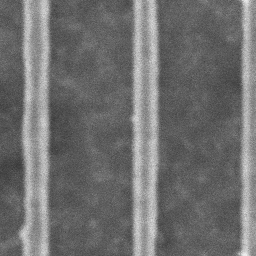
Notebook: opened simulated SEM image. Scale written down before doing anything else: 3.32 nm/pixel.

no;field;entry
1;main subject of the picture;one or a few lines or trenches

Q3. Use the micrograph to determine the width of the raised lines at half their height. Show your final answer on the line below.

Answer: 0.0556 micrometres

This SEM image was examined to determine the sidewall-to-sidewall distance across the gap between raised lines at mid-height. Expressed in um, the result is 0.305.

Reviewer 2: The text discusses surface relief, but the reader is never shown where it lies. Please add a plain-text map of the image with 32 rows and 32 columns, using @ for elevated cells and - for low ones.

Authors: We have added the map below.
---@@@-----------@@------------@
---@@@-----------@@------------@
---@@@-----------@@------------@
---@@@-----------@@------------@
---@@@-----------@@------------@
---@@@-----------@@------------@
---@@@-----------@@------------@
---@@@-----------@@------------@
---@@@-----------@@------------@
---@@------------@@------------@
---@@------------@@------------@
----@------------@@------------@
---@@------------@@------------@
---@@------------@@------------@
---@@------------@@------------@
---@@@-----------@@------------@
---@@@-----------@@------------@
---@@------------@@------------@
---@@------------@@------------@
---@@@-----------@@------------@
----@@-----------@@------------@
---@@@-----------@@------------@
---@@@-----------@@------------@
----@@-----------@@------------@
----@@-----------@@------------@
---@@------------@@------------@
----@@-----------@@------------@
----@@-----------@@------------@
---@@@-----------@@------------@
---@@@-----------@@------------@
---@@@-----------@@------------@
---@@@-----------@@------------@